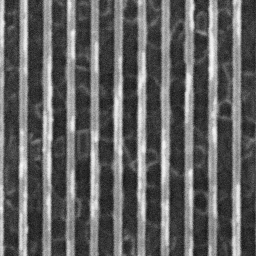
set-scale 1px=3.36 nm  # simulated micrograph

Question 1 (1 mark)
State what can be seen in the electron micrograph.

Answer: parallel lines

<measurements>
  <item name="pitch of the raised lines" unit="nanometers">79.4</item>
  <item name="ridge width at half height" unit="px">6.49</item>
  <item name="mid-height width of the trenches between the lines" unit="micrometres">0.0558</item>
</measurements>